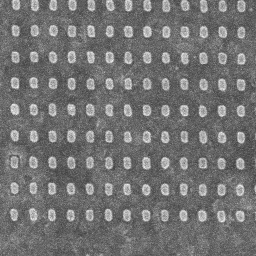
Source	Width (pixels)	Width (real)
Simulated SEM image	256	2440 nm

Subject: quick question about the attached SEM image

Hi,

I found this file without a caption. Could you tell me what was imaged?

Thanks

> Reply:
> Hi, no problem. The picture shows a regular array of raised bodies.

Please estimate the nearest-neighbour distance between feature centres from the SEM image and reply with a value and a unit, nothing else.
0.176 microns